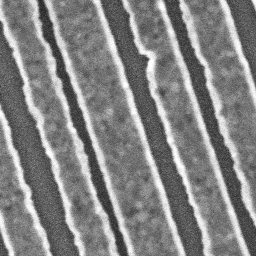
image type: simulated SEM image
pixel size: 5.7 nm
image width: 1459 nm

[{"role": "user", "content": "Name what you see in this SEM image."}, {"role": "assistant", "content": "one or a few lines or trenches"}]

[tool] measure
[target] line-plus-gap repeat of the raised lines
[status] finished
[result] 60.7 pixels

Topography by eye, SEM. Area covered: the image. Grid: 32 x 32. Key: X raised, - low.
XXXX--XXXXXX----XXXX---XXXXX----
XXXXX-XXXXXXX---XXXXX--XXXXX----
XXXXX--XXXXXX---XXXXX--XXXXXX---
-XXXX--XXXXXX----XXXX---XXXXX---
-XXXX--XXXXXXX---XXXXX--XXXXX---
--XXXX--XXXXXX---XXXXX--XXXXXX--
--XXXX--XXXXXX----XXXX---XXXXX--
--XXXX--XXXXXXX----XXXX--XXXXX--
---XXXX--XXXXXX----XXXX---XXXXX-
---XXXX--XXXXXX----XXXX---XXXXX-
---XXXX--XXXXXXX---XXXXX--XXXXX-
---XXXX---XXXXXX---XXXXX--XXXXXX
----XXXX--XXXXXX---XXXXX---XXXXX
----XXXX--XXXXXXX---XXXXX--XXXXX
-----XXXX--XXXXXX---XXXXX--XXXXX
X----XXXX--XXXXXX----XXXX---XXXX
X----XXXX--XXXXXXX---XXXXX--XXXX
X----XXXXX--XXXXXX---XXXXX--XXXX
X-----XXXX--XXXXXX----XXXX---XXX
XX----XXXX--XXXXXXX---XXXXX--XXX
XX-----XXXX--XXXXXX---XXXXX---XX
XXX----XXXX--XXXXXX----XXXX---XX
XXX----XXXX--XXXXXXX---XXXXX--XX
XXX-----XXX---XXXXXX---XXXXX--XX
XXXX----XXXX--XXXXXX----XXXX---X
XXXX----XXXX--XXXXXXX---XXXXX--X
XXXX----XXXXX--XXXXXX---XXXXX--X
XXXXX----XXXX--XXXXXX----XXXX---
XXXXX----XXXX--XXXXXXX---XXXXX--
-XXXX-----XXXX--XXXXXX----XXXX--
-XXXXX----XXXX--XXXXXX----XXXX--
-XXXXX----XXXX--XXXXXXX---XXXXX-